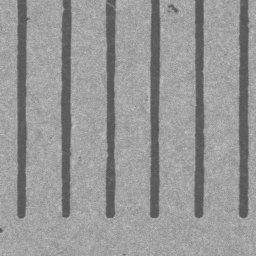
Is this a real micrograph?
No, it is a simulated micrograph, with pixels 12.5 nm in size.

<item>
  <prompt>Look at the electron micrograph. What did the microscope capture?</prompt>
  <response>parallel lines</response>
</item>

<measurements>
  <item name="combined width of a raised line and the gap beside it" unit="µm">0.565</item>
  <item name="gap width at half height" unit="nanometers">122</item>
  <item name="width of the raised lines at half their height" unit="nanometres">421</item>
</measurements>